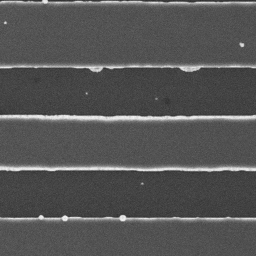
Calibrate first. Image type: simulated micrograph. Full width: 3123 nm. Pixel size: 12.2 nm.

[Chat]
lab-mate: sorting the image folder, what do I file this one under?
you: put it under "lines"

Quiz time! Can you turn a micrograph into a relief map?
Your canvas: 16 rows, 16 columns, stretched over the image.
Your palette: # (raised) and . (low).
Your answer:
################
################
################
################
................
................
................
################
################
################
################
................
................
................
################
################